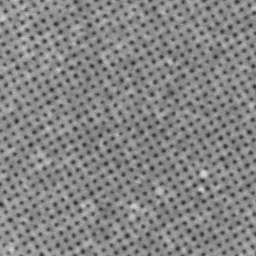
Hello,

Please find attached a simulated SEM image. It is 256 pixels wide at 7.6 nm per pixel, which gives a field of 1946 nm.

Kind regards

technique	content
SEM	a regular array of holes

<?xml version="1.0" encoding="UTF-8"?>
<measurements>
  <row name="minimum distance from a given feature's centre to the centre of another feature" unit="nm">68.2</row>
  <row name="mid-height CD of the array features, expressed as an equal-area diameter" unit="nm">29.7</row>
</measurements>